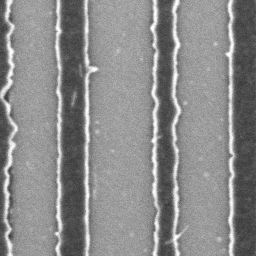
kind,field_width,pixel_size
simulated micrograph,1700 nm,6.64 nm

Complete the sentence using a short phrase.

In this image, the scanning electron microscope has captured one or a few lines or trenches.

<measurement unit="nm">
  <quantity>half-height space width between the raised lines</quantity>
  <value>360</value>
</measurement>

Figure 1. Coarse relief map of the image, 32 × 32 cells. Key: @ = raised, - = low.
@------@@@@--------@@@-------@@@
@------@@@@--------@@@-------@@@
@------@@@@--------@@@-------@@@
@@-----@@@@--------@@@-------@@@
@------@@@@--------@@@-------@@@
@------@@@@--------@@@-------@@@
@@-----@@@@--------@@@-------@@@
@------@@@@--------@@@-------@@@
@@-----@@@@@-------@@@-------@@@
@------@@@@--------@@@-------@@@
@------@@@@--------@@@-------@@@
-------@@@@--------@@@-------@@@
@------@@@@--------@@@-------@@@
@------@@@@--------@@@-------@@@
@------@@@@--------@@@-------@@@
@@-----@@@@--------@@@-------@@@
@@-----@@@@--------@@@-------@@@
@------@@@@--------@@@-------@@@
@------@@@@--------@@@-------@@@
@------@@@@--------@@@-------@@@
@------@@@@--------@@@-------@@@
@------@@@@--------@@@-------@@@
@------@@@@--------@@@-------@@@
@------@@@@--------@@@-------@@@
@------@@@@--------@@@-------@@@
@------@@@@--------@@@-------@@@
@------@@@@---------@@-------@@@
@------@@@@--------@@@-------@@@
@------@@@@---------@@-------@@@
@------@@@@--------@@@-------@@@
@------@@@@--------@@@-------@@@
@------@@@@--------@@@-------@@@